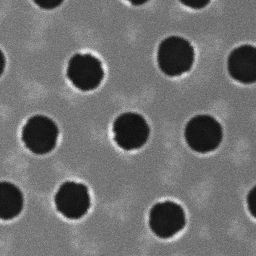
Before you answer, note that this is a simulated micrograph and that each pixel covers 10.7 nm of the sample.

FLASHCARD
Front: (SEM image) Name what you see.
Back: holes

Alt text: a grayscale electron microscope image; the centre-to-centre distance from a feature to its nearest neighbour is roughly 781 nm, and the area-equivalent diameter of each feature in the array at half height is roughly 0.413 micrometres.